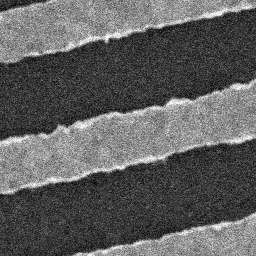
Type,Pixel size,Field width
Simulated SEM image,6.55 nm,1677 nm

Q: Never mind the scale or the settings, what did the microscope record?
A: one or a few lines or trenches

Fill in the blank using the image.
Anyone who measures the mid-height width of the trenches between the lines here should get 0.502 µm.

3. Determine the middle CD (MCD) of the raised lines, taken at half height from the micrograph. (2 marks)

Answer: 330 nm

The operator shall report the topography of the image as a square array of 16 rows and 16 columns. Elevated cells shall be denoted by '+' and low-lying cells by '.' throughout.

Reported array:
.+++++++++++++++
+++++++++++.....
++++++..........
++..............
................
..............++
...........+++++
......++++++++++
..++++++++++++++
+++++++++++.....
++++++++........
+++.............
................
................
...........+++++
.......+++++++++